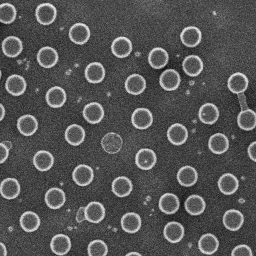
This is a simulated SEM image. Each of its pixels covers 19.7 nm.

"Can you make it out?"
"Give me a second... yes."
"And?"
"a regular array of raised bodies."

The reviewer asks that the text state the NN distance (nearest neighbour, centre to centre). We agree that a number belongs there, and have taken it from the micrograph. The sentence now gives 698 nanometres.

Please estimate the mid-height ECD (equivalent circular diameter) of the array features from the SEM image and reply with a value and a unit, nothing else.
381 nm